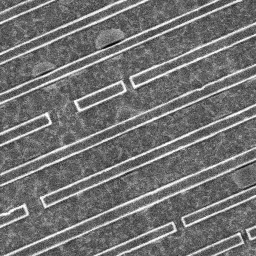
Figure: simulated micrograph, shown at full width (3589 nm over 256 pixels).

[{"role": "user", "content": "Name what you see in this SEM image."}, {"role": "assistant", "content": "parallel lines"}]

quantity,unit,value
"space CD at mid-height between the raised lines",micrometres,0.38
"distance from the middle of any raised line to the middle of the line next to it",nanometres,524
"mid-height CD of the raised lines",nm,148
